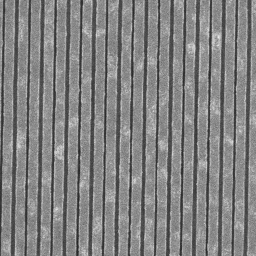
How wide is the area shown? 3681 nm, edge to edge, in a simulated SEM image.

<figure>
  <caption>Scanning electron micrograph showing parallel lines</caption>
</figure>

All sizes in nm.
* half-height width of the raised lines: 137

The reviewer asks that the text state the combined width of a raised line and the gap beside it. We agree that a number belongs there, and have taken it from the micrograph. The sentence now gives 186 nm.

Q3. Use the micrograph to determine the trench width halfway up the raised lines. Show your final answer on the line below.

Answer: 48.5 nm